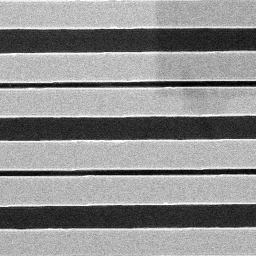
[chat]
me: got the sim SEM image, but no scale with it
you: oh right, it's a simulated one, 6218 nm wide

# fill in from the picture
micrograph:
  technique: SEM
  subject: lines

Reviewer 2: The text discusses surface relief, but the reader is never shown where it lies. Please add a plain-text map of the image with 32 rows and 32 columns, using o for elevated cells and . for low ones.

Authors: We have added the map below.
oooooooooooooooooooooooooooooooo
oooooooooooooooooooooooooooooooo
oooooooooooooooooooooooooooooooo
ooooooooooooooooo...............
................................
................................
................................
oooooooooooooooooooooooooooooooo
oooooooooooooooooooooooooooooooo
oooooooooooooooooooooooooooooooo
oooooooooooooooooooooooooooooooo
oooooooooooooooooooooooooooooooo
oooooooooooooooooooooooooooooooo
oooooooooooooooooooooooooooooooo
oooooooooooooooo................
................................
................................
...........................ooooo
oooooooooooooooooooooooooooooooo
oooooooooooooooooooooooooooooooo
oooooooooooooooooooooooooooooooo
oooooooooooooooooooooooooooooooo
oooooooooooooooooooooooooooooooo
oooooooooooooooooooooooooooooooo
oooooooooooooooooooooooooooooooo
ooooooooooooooooooooooo.........
................................
................................
................................
oooooooooooooooooooooooooooooooo
oooooooooooooooooooooooooooooooo
oooooooooooooooooooooooooooooooo